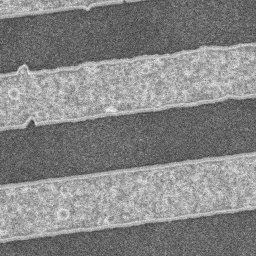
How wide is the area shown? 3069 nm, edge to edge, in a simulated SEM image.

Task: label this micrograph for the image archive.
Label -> one or a few lines or trenches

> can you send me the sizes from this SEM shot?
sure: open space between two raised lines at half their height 685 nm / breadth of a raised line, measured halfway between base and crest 639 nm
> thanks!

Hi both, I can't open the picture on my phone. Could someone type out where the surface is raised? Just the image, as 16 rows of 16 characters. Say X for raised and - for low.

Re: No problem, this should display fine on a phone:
XXXXX-----------
----------------
----------------
----------XXXXXX
-XXXXXXXXXXXXXXX
XXXXXXXXXXXXXXXX
XXXXXXXXXXXX----
XXXXX-----------
----------------
----------------
---------XXXXXXX
--XXXXXXXXXXXXXX
XXXXXXXXXXXXXXXX
XXXXXXXXXXXX----
XXXX------------
----------------